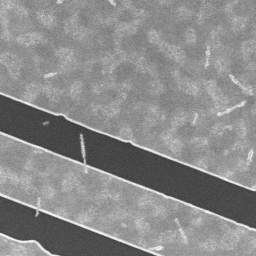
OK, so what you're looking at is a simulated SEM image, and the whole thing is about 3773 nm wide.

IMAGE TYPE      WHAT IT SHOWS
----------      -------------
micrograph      one or a few lines or trenches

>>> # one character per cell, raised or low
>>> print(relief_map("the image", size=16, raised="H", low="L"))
HHHHHHHHHHHHHHHH
HHHHHHHHHHHHHHHH
HHHHHHHHHHHHHHHH
HHHHHHHHHHHHHHHH
HHHHHHHHHHHHHHHH
HHHHHHHHHHHHHHHH
LLHHHHHHHHHHHHHH
LLLLHHHHHHHHHHHH
LLLLLLLHHHHHHHHH
HHHLLLLLLLHHHHHH
HHHHHHLLLLLLHHHH
HHHHHHHHLLLLLLLH
LHHHHHHHHHHLLLLL
LLLHHHHHHHHHHHLL
LLLLLLHHHHHHHHHH
HHHLLLLLLHHHHHHH